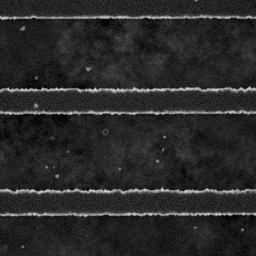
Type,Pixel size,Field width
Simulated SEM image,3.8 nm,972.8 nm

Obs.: lines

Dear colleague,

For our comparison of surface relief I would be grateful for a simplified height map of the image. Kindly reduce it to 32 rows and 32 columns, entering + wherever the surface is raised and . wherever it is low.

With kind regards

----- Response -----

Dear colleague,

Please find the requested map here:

++++++++++++++++++++++++++++++++
++++++++++++++++++++++++++++++++
................................
................................
................................
................................
................................
................................
................................
................................
................................
++++++++++++++++++++++++++++++++
++++++++++++++++++++++++++++++++
++++++++++++++++++++++++++++++++
................................
................................
................................
................................
................................
................................
................................
................................
................................
................................
++++++++++++++++++++++++++++++++
++++++++++++++++++++++++++++++++
++++++++++++++++++++++++++++++++
................................
................................
................................
................................
................................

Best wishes